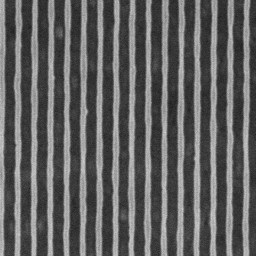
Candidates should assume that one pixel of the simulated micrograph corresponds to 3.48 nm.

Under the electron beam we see parallel lines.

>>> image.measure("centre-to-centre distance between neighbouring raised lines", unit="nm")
56.6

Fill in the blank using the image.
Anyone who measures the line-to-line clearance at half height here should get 0.0408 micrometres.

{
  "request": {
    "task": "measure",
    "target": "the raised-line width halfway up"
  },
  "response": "0.0169 micrometres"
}